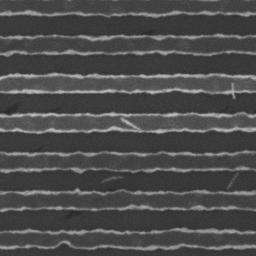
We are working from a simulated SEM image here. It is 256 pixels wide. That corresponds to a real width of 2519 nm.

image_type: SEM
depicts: parallel lines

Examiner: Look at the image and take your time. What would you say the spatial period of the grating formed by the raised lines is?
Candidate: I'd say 383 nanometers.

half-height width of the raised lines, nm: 162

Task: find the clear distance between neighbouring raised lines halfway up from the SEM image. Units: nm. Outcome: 216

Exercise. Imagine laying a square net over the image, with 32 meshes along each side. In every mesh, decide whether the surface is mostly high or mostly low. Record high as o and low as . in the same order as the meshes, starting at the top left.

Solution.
oooooooooooooooooooooooooooooooo
oooooooooooooooooooooooooooooooo
................................
................................
......oo..o...oo.oo.......oo...o
oooooooooooooooooooooooooooooooo
ooooooooooooooooooo.oooooooooooo
................................
................................
.oooooooo..oo...oo.o..ooooooo...
oooooooooooooooooooooooooooooooo
ooooooooooo.o..oo.........oooo.o
................................
................................
oooooooooooooooooooooooooooooooo
oooooooooooooooooooooooooooooooo
...ooo..o.o......ooo.....o......
................................
................................
oooooooooooooooooooooooooooooooo
oooooooooooooooooooooooooooooooo
................................
................................
................................
oooooooooooooooooooooooooooooooo
oooooooooooooooooooooooooooooooo
................................
................................
................................
oooooooooooooooooooooooooooooooo
oooooooo.ooooooooooooooooooooooo
................................